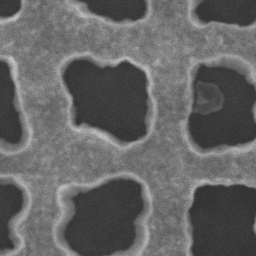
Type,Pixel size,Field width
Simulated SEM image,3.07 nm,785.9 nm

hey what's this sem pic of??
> holes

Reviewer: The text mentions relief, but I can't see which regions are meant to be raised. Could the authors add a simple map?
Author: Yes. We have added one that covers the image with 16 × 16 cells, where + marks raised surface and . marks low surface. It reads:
.++++....+++....
++++++++++++++..
++++++++++++++++
++++++++++++++++
.+++.....+++...+
.+++.....+++....
.+++.....+++....
.++++....+++....
..+++++..+++....
++++++++++++++++
++++++++++++++++
.+++++...+++++++
..++.....+++....
.+++.....+++....
.+++.....+++....
.+++....++++....